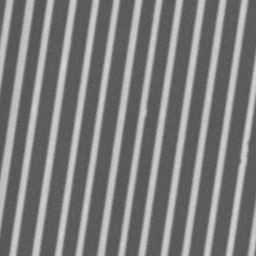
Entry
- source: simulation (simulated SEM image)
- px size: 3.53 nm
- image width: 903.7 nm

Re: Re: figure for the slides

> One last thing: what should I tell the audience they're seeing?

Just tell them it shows parallel lines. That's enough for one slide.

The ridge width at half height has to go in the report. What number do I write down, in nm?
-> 19.6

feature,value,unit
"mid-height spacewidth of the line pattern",58.5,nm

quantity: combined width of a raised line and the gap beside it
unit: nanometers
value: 75.1